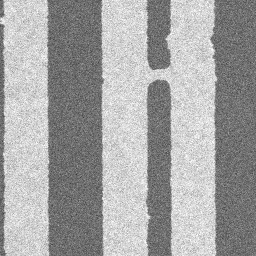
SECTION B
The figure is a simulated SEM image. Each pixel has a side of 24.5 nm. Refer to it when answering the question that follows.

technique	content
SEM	one or a few lines or trenches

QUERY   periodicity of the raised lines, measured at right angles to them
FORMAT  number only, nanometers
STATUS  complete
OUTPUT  2040